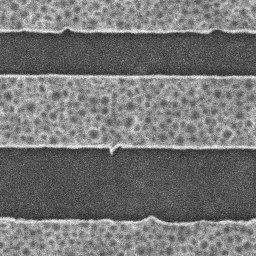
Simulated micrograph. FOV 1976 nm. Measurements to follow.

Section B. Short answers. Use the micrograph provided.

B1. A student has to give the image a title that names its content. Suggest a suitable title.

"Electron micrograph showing one or a few lines or trenches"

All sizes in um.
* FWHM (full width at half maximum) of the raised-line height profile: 0.544